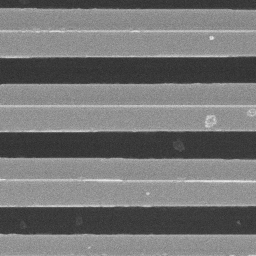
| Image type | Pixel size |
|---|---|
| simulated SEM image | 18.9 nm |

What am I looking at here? lines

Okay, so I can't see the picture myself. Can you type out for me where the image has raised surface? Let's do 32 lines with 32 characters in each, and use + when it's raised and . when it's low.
................................
++++++++++++++++++++++++++++++++
++++++++++++++++++++++++++++++++
++++++++++++++++++++++++++++++++
++++++++++++++++++++++++++++++++
++++++++++++++++++++++++++++++++
++++++++++++++++++++++++++++++++
................................
................................
................................
....................++..++++++++
++++++++++++++++++++++++++++++++
++++++++++++++++++++++++++++++++
++++++++++++++++++++++++++++++++
++++++++++++++++++++++++++++++++
++++++++++++++++++++++++++++++++
................................
................................
................................
................................
++++++++++++++++++++++++++++++++
++++++++++++++++++++++++++++++++
++++++++++++++++++++++++++++++++
++++++++++++++++++++++++++++++++
++++++++++++++++++++++++++++++++
++++++++++++++++++++++++++++++++
................................
................................
................................
++++++++++++++++++++++++++++++++
++++++++++++++++++++++++++++++++
++++++++++++++++++++++++++++++++